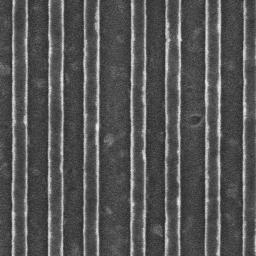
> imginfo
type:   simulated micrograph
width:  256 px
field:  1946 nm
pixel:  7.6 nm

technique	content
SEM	parallel lines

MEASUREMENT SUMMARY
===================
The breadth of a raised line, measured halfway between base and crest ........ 101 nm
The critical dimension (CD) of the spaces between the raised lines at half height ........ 177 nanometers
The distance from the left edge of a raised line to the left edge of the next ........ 293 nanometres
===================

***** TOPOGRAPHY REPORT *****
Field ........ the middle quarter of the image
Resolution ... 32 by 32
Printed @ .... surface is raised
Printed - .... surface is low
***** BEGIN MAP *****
-----@@@@--------@@@------@@@---
-----@@@@--------@@@------@@@---
-----@@@@--------@@@------@@@---
-----@@@---------@@@------@@@---
-----@@@---------@@@------@@@---
-----@@@---------@@@------@@@---
-----@@@---------@@@------@@@---
-----@@@---------@@@------@@@---
-----@@@---------@@@------@@@---
-----@@@---------@@@------@@@---
-----@@@---------@@@------@@@---
-----@@@---------@@@------@@@---
-----@@@---------@@@------@@@---
-----@@@---------@@@------@@@---
-----@@@---------@@@------@@@---
-----@@@---------@@@------@@@---
-----@@@---------@@@------@@@---
-----@@@---------@@@------@@@---
-----@@@---------@@@------@@@---
-----@@@---------@@@------@@@---
-----@@@---------@@@------@@@---
-----@@@---------@@@------@@@---
-----@@@---------@@@------@@@---
-----@@@---------@@@------@@@---
-----@@@---------@@@------@@@---
-----@@@---------@@@------@@@---
-----@@@---------@@@------@@@---
-----@@@---------@@@------@@@---
-----@@@---------@@@------@@@---
-----@@@---------@@@------@@@---
-----@@@---------@@@------@@@---
-----@@@---------@@@------@@@---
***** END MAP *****